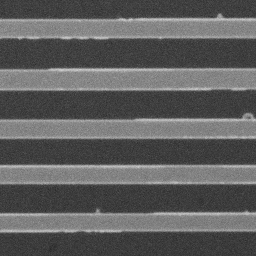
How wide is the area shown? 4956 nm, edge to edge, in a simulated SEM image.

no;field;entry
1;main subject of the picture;lines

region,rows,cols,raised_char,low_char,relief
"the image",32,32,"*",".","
................................
................................
.................***************
********************************
********************************
................................
................................
................................
................................
********************************
********************************
................................
................................
................................
................................
********************************
********************************
................................
................................
................................
................................
********************************
********************************
................................
................................
................................
................................
********************************
********************************
................................
................................
................................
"